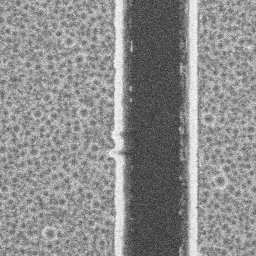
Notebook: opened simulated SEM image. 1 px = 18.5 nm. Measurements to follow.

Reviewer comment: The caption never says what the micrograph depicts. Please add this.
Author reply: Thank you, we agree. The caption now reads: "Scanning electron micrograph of one or a few lines or trenches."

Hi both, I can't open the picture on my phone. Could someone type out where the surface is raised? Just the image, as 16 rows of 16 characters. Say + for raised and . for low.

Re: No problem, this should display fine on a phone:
+++++++.....++++
+++++++.....++++
+++++++.....++++
+++++++.....++++
+++++++.....++++
+++++++.....++++
+++++++.....++++
+++++++.....++++
+++++++.....++++
+++++++.....++++
+++++++.....++++
+++++++.....++++
+++++++.....++++
++++++++....++++
+++++++.....++++
+++++++.....++++